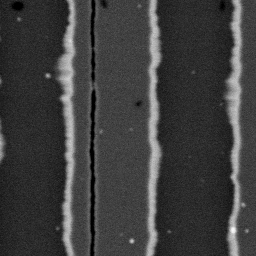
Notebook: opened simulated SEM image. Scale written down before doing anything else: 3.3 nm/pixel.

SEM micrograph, lines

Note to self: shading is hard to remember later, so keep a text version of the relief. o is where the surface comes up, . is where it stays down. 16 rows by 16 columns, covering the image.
....oooooo.....o
....oooooo.....o
....oooooo.....o
....oooooo.....o
....oooooo.....o
....oooooo.....o
....oooooo.....o
....oooooo.....o
....oooooo.....o
....oooooo.....o
....oooooo.....o
....oooooo.....o
....oooooo.....o
....ooooo......o
....oooooo.....o
....ooooo......o